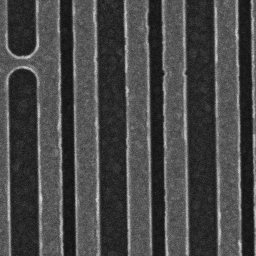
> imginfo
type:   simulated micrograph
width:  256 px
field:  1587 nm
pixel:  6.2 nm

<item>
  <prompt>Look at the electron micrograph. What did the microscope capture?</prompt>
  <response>parallel lines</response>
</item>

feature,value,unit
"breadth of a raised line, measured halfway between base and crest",150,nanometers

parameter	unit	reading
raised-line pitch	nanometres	278